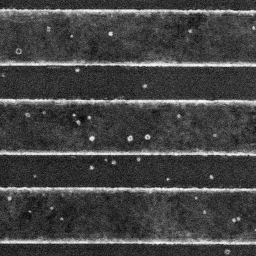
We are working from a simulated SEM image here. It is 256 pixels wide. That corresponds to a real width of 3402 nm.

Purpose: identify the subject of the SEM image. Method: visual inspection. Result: lines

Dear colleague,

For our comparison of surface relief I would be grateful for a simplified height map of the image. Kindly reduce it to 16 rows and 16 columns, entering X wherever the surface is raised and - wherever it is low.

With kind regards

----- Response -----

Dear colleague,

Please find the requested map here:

----------------
XXXXXXXXXXXXXXXX
XXXXXXXXXXXXXXXX
XXXXXXXXXXXXXXXX
----------------
----------------
XXXXXXXXXXXXXXXX
XXXXXXXXXXXXXXXX
XXXXXXXXXXXXXXXX
XXXXXXXXXXXXXXXX
----------------
----------------
XXXXXXXXXXXXXXXX
XXXXXXXXXXXXXXXX
XXXXXXXXXXXXXXXX
----------------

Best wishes